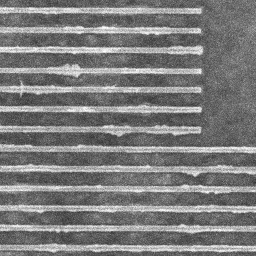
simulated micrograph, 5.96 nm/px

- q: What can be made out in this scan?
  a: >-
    parallel lines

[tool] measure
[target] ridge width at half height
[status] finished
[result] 30.5 nm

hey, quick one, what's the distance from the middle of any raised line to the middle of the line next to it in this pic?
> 118 nm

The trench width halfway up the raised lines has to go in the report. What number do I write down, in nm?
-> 84.9